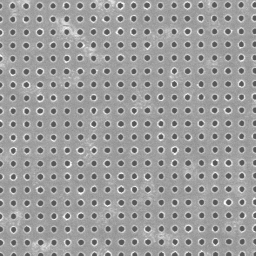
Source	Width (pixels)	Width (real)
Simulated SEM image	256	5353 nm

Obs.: a regular array of holes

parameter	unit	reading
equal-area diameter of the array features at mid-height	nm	118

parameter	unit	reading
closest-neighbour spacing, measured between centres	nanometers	272